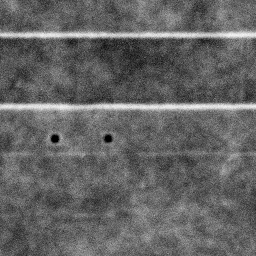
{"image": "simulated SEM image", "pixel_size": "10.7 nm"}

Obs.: wiring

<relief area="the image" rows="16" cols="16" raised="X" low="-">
XXXXXXXXXXXXXXXX
XXXXXXXXXXXXXXXX
----------------
----------------
----------------
----------------
----------------
XXXXXXXXXXXXXXXX
XXXXXXXXXXXXXXXX
XXXXXXXXXXXXXXXX
XXXXXXXXXXXXXXXX
XXXXXXXXXXXXXXXX
XXXXXXXXXXXXXXXX
XXXXXXXXXXXXXXXX
XXXXXXXXXXXXXXXX
XXXXXXXXXXXXXXXX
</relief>